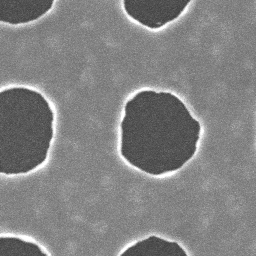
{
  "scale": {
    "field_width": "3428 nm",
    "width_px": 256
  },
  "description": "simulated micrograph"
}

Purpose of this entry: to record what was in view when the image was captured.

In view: holes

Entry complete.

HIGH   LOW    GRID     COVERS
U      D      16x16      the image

DDDUUUUUDDDDUUUU
UUUUUUUUUDUUUUUU
UUUUUUUUUUUUUUUU
UUUUUUUUUUUUUUUU
UUUUUUUUUUUUUUUU
DDUUUUUUUUUUUUUU
DDDUUUUUDDDUUUUU
DDDUUUUUDDDDUUUU
DDDUUUUUDDDDUUUU
DDDUUUUUDDDDUUUU
DDUUUUUUUDDUUUUU
UUUUUUUUUUUUUUUU
UUUUUUUUUUUUUUUU
UUUUUUUUUUUUUUUU
UUUUUUUUUUUUUUUU
DDDUUUUUDDDUUUUU